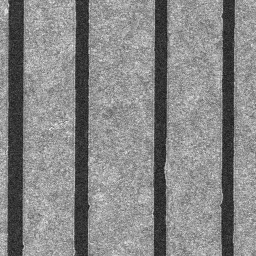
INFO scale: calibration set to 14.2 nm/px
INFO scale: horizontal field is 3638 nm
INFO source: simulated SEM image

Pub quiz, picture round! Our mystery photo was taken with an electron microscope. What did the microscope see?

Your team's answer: one or a few lines or trenches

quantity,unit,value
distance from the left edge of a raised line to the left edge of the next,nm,1030